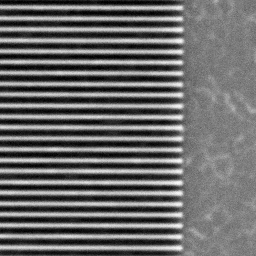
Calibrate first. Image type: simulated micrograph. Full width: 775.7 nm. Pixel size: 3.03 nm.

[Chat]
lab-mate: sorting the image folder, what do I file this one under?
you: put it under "parallel lines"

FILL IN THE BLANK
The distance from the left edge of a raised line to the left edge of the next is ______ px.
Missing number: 10.9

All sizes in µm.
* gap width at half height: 0.0231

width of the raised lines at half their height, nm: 10.2